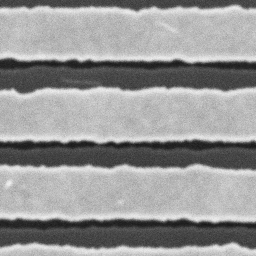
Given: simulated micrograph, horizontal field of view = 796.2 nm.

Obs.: lines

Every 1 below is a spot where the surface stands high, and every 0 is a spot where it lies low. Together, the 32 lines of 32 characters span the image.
00000000000000000000000000000000
11111111111111111111111111111111
11111111111111111111111111111111
11111111111111111111111111111111
11111111111111111111111111111111
11111111111111111111111111111111
11111111111111111111111111111111
00111101101111111111110111111111
00000000000000000000000000000000
00000000000000000000000000000000
00000000000000000000000000000000
11001111111111111111111111111111
11111111111111111111111111111111
11111111111111111111111111111111
11111111111111111111111111111111
11111111111111111111111111111111
11111111111111111111111111111111
11111111111111111111111101111111
00000000000000000000000000000000
00000000000000000000000000000000
00000000000000000000000000000000
11111111111111111111111111111111
11111111111111111111111111111111
11111111111111111111111111111111
11111111111111111111111111111111
11111111111111111111111111111111
11111111111111111111111111111111
00000000110010000000100011111111
00000000000000000000000000000000
00000000000000000000000000000000
00001000000000000000000000000000
11111111111111111111111111111111